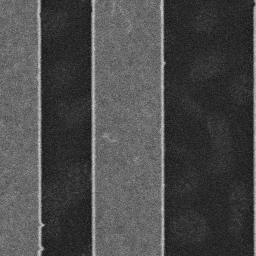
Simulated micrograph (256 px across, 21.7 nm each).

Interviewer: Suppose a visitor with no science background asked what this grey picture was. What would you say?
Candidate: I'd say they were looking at one or a few lines or trenches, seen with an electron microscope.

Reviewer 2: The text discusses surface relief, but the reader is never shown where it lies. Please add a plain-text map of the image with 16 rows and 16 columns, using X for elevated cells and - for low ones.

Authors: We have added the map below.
XX----XXXX------
XX----XXXX------
XX----XXXX------
XX----XXXX------
XX----XXXX------
XX----XXXX------
XX----XXXX------
XX----XXXX------
XX----XXXX------
XX----XXXX------
XX----XXXX------
XX----XXXX------
XX----XXXX------
XXX---XXXX------
XXX---XXXX------
XXX---XXXX------